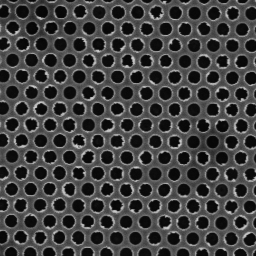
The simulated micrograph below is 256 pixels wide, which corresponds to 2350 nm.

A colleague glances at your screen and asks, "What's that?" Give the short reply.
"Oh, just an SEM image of a regular array of holes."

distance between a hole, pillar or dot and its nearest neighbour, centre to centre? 169 nm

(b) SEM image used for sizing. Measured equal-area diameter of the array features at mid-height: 12 pixels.